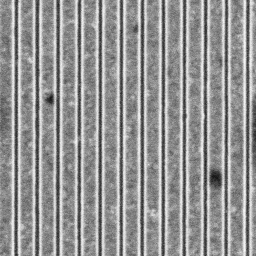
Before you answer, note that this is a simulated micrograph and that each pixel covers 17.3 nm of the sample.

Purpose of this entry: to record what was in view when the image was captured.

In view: parallel lines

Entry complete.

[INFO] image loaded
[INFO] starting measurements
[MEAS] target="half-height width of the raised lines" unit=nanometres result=282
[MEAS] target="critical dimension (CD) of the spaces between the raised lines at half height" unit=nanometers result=82.3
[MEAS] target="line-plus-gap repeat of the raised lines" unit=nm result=364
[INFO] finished